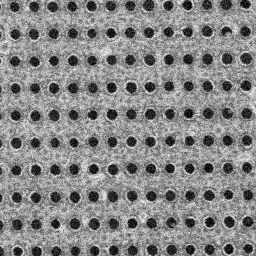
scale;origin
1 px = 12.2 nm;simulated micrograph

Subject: a regular array of holes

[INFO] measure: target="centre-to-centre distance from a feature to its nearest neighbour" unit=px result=19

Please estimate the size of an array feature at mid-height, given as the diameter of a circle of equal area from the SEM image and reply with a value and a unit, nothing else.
0.138 µm